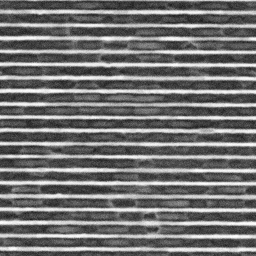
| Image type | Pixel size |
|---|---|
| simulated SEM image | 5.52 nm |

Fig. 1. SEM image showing parallel lines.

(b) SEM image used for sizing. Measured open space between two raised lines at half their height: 56.5 nm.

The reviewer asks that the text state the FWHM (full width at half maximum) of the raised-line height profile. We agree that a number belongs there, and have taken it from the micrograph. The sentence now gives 14.5 nanometers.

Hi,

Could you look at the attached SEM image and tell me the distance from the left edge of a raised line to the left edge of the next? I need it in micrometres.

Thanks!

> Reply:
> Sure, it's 0.0727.